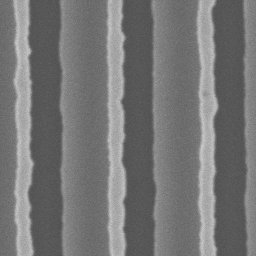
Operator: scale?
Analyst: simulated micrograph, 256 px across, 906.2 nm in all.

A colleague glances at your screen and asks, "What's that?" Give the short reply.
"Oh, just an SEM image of lines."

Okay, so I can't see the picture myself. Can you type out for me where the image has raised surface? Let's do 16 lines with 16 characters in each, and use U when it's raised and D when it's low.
UUDDUUUUDDUUUDDU
UUDDUUUUDDUUUDDU
UUDDUUUUDDUUUDDU
UUDDUUUUDDUUUDDU
UUDDUUUUDDUUUDDU
UUDDUUUUDDUUUDDU
UUDDUUUUDDUUUUDU
UUDDUUUUDDUUUDDU
UUDDUUUUDDUUUDDU
UUDDUUUUDDUUUDDU
UUDDUUUUDDUUUDDU
UUDDUUUUDDUUUDDU
UUDDUUUUDDUUUDDU
UUDDUUUUDDUUUDDU
UUDDUUUUDDUUUDDU
UUDDUUUUDDUUUDDU